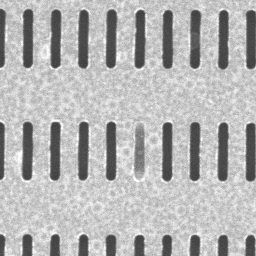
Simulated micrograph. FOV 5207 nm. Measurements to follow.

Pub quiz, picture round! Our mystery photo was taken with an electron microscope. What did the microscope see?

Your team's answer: a regular array of holes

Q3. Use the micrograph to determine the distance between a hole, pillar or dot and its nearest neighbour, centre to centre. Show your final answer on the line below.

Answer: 0.563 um